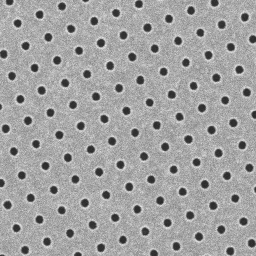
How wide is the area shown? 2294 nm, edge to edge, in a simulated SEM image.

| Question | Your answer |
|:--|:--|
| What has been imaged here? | a regular array of holes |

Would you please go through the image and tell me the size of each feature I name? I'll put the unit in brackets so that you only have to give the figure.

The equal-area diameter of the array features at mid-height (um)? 0.0763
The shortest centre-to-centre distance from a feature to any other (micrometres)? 0.209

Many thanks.